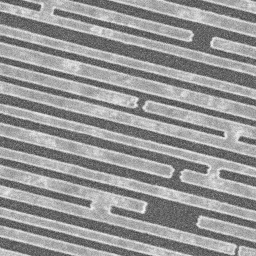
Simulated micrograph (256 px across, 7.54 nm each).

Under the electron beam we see parallel lines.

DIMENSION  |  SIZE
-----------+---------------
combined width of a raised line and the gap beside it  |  149 nm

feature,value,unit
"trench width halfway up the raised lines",74.9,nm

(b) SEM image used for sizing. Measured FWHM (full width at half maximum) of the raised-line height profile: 74.9 nm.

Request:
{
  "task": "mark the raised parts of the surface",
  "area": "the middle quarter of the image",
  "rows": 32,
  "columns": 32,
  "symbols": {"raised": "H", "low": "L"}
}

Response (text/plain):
HHHHHHHLLLLLLLLHHHHHHHHHLLLLLLLL
HHHHHHHHHHHLLLLLLLLLHHHHHHHHLLLL
LLLHHHHHHHHHHHHLLLLLLLLLHHHHHHHH
LLLLLLLHHHHHHHHHHHHLLLLLLLLLHHHH
HHLLLLLLLLLHHHHHHHHHHHHLLLLLLLLL
HHHHHHLLLLLLLLLHHHHHHHHHHHHLLLLL
HHHHHHHHHHLLLLLLLLLHHHHHHHHHHHLL
LLLHHHHHHHHHHHHLLLLLLLLHHHHHHHHH
LLLLLLLHHHHHHHHHHHLLLLLLLLLHHHHH
HHHHLLLLLLLHHHHHHHLLLHLLLLLLLLLH
HHHHHHHHLLLLLLLHHHLLHHHHHHLLLLLL
LHHHHHHHHHHHLLLLLLLLHHHHHHHHHHLL
LLLLLHHHHHHHHHHHLLLLLLLLHHHHHHHH
LLLLLLLLLHHHHHHHHHHHLLLLLLLHHHHH
HHLLLLLLLLLLLHHHHHHHHHHHLLLLLLLH
HHHHHHLLLLLLLLLLLHHHHHHHHHHHLLLL
LLHHHHHHHHLLLLLLLLLLLHHHHHHHHHHH
LLLLLLHHHHHHHHLLLLLLLLLLLHHHHHHH
LLLLLLLLLLHHHHHHHHLLLLLLLLLLLHHH
HHLLLLLLLLLLLLHHHHHHHHLLLLLLLLLL
HHHHHHLLLLLLLLLLLLHHHHHHHHLLLLLL
HHHHHHHHHHLLLLLLLLLLLLHHHHHHHHLL
LLHHHHHHHHHHHHLLLLLLLLLLLHHHHHHH
LLLLLLLHHHHHHHHHHHLLLLLLLLLLLHHH
LLLLLLLLLLLHHHHHHHHHHHLLLLLLLLLL
HHHLLLLLLLLLLLLHHHHHHHHHHHLLLLLL
HHHHHHHLLLLLLLLLLLLHHHHHHHHLLLLL
LLHHHHHHHHHLLLLLLLLLLLLHHHHLLHHH
LLLLLLHHHHHHHHHLLLLLLLLLLLLLLHHH
LLLLLLLLLLHHHHHHHHHLLLLLLLLLLLHH
HHHHLLLLLLLLLLHHHHHHHHHLLLLLLLLL
HHHHHHHHLLLLLLLLLLHHHHHHHHHLLLLL